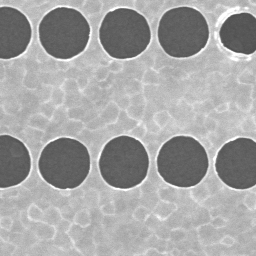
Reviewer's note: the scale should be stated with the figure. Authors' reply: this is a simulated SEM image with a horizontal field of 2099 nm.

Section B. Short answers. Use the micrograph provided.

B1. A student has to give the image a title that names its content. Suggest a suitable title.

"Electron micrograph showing holes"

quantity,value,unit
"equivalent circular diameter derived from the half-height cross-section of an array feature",424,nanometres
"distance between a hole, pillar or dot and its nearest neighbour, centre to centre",0.481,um